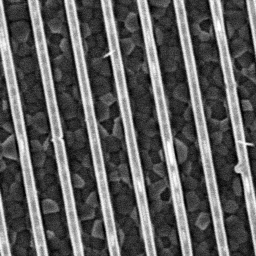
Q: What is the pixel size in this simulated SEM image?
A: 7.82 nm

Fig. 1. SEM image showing parallel lines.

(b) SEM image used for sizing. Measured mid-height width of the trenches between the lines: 214 nm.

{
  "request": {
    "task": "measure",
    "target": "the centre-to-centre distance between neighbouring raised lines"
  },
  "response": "0.28 um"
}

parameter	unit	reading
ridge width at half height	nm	66.4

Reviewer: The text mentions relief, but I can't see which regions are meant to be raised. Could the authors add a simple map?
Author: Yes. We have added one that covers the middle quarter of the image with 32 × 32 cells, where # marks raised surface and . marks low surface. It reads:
...##.......###......##........#
...##.......###.......##.......#
....##.......##.......##.......#
....##.......##.......##.......#
....##.......##.......##.......#
....##.......##.......##........
....##.......###......###.......
....##........##.......##.......
.....##.......##.......##.......
.....##.......##.......##.......
.....##.......##.......##.......
.....##.......##.......###......
.....##........#........##......
.....###.......##.......##......
......##.......##.......##......
......##.......##.......##......
......##.......##.......###.....
......###.......#.......###.....
......###.......##.......##.....
.......##.......##.......##.....
.......##.......##.......##.....
.......##.......##.......##.....
.......##.......##........##....
#......##.......###.......##....
#......###.......##.......##....
#.......##.......##.......##....
#.......##.......##.......##....
#.......##.......##.......##....
#.......##.......###.......##...
#.......##.......###.......##...
##.......##.......##.......##...
##.......##.......##.......##...